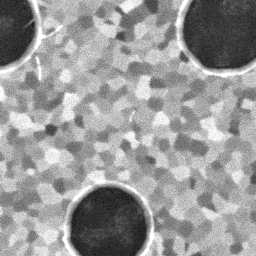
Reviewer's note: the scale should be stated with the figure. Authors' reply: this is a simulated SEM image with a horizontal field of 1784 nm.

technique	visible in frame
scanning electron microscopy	holes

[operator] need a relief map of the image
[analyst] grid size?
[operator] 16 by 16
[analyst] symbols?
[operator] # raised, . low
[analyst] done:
..##########....
..#########.....
..#########.....
..##########....
################
################
################
################
################
################
################
################
#####....#######
####.....#######
####.....#######
#####....#######